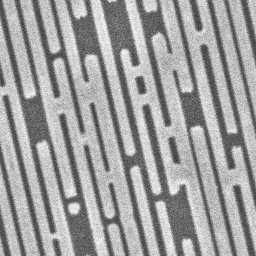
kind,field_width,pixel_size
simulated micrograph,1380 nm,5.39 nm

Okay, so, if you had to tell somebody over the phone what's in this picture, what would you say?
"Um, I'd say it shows parallel lines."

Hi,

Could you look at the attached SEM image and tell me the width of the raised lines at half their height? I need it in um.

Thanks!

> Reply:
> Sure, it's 0.0538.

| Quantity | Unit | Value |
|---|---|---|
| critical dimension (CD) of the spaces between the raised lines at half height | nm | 39.4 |